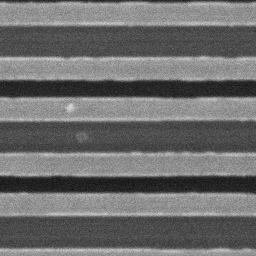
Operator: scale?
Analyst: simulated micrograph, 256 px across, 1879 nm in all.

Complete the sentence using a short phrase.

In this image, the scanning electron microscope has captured lines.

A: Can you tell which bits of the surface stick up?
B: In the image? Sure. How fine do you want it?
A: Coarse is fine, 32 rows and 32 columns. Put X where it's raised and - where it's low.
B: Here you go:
XXXXXXXXXXXXXXXXXXXXXXXXXXXXXXXX
XXXXXXXXXXXXXXXXXXXXXXXXXXXXXXXX
XXXXXXXXXXXXXXXXXXXXXXXXXXXXXXXX
--------------------------------
--------------------------------
--------------------------------
--------------------------------
XXXXXXXXXXXXXXXXXXXXXXXXXXXXXXXX
XXXXXXXXXXXXXXXXXXXXXXXXXXXXXXXX
XXXXXXXXXXXXXXXXXXXXXXXXXXXXXXXX
--------------------------------
--------------------------------
XXXXXXXXXXXXXXXXXXXXXXXXXXXXXXXX
XXXXXXXXXXXXXXXXXXXXXXXXXXXXXXXX
XXXXXXXXXXXXXXXXXXXXXXXXXXXXXXXX
--------------------------------
--------------------------------
--------------------------------
--------------------------------
XXXXXXXXXXXXXXXXXXXXXXXXXXXXXXXX
XXXXXXXXXXXXXXXXXXXXXXXXXXXXXXXX
XXXXXXXXXXXXXXXXXXXXXXXXXXXXXXXX
--------------------------------
--------------------------------
XXXXXXXXXXXXXXXXXXXXXXXXXXXXXXXX
XXXXXXXXXXXXXXXXXXXXXXXXXXXXXXXX
XXXXXXXXXXXXXXXXXXXXXXXXXXXXXXXX
--------------------------------
--------------------------------
--------------------------------
--------------------------------
XXXXXXXXXXXXXXXXXXXXXXXXXXXXXXXX